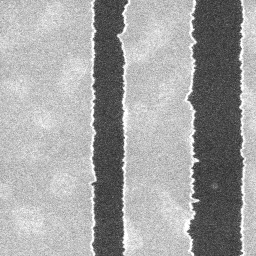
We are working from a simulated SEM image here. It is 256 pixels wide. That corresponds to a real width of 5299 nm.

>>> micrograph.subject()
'one or a few lines or trenches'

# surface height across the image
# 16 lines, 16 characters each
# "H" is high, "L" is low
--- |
HHHHHHLLHHHHLLLH
HHHHHHLLHHHHLLLH
HHHHHHLLHHHHLLLH
HHHHHHLLHHHHLLLH
HHHHHHLLHHHHLLLH
HHHHHHLLHHHHLLLH
HHHHHHLLHHHHLLLH
HHHHHHLLHHHHLLLH
HHHHHHLLHHHHLLLH
HHHHHHLLHHHHLLLH
HHHHHHLLHHHHLLLH
HHHHHHLLHHHHLLLH
HHHHHHLLHHHHLLLH
HHHHHHLLHHHHLLLH
HHHHHHLLHHHHLLLH
HHHHHHLLHHHHLLLH